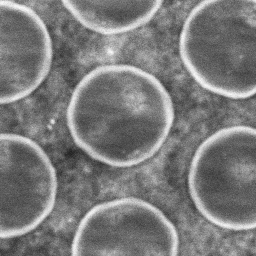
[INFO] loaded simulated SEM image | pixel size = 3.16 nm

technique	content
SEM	raised bodies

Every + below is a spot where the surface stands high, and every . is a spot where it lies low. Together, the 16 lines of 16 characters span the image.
+...++++++..++++
+++..++++...++++
+++........+++++
+++........+++++
+++...+++...++++
++...+++++...+++
....++++++......
....+++++++.....
.....+++++....++
+++...+++...++++
+++.........++++
+++.........++++
+++.........++++
+++...++++...+++
+....++++++.....
.....++++++.....